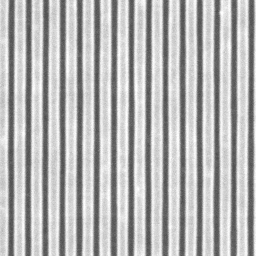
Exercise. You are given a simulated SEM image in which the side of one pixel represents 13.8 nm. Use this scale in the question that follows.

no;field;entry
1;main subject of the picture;parallel lines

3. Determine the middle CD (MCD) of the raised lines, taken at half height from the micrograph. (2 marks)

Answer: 130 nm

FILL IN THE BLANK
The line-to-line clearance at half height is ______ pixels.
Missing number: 7.75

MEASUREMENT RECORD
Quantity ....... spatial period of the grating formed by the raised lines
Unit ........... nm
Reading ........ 236